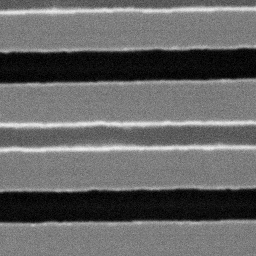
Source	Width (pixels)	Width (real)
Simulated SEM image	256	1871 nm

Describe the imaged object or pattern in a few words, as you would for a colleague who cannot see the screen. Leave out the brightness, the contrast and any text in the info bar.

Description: lines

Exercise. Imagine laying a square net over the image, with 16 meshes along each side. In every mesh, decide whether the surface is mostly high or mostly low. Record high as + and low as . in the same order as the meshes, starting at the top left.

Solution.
++++++++++++++++
++++++++++++++++
++++++++++++++++
................
................
++++++++++++++++
++++++++++++++++
++++++++++++++++
++++++++++++++++
++++++++++++++++
++++++++++++++++
++++++++++++++++
................
................
++++++++++++++++
++++++++++++++++